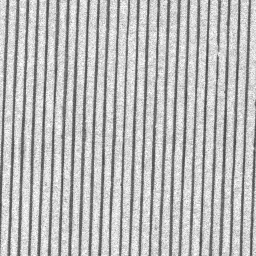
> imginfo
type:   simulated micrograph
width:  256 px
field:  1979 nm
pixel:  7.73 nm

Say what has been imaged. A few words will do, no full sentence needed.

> parallel lines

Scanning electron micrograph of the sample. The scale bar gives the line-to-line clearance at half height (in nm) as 20.3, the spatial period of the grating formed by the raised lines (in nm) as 78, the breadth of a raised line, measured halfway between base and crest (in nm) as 59.9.